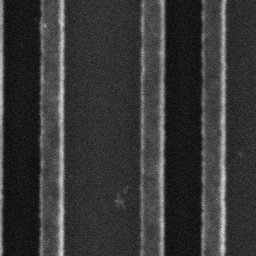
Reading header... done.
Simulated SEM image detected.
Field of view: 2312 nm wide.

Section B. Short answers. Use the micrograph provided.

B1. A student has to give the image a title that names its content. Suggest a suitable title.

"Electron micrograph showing lines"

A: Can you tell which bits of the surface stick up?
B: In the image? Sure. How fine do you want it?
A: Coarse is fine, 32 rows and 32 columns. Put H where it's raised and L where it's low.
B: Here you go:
LLLLLHHHLLLLLLLLLLHHHLLLLHHHLLLL
LLLLLHHHLLLLLLLLLLHHHLLLLHHHLLLL
LLLLLHHHLLLLLLLLLLHHHLLLLHHHLLLL
LLLLLHHHLLLLLLLLLLHHHLLLLHHHLLLL
LLLLLHHHLLLLLLLLLLHHHLLLLHHHLLLL
LLLLLHHHLLLLLLLLLLHHHLLLLHHHLLLL
LLLLLHHHLLLLLLLLLLHHHLLLLHHHLLLL
LLLLLHHHLLLLLLLLLLHHHLLLLHHHLLLL
LLLLLHHHLLLLLLLLLLHHHLLLLHHHLLLL
LLLLLHHHLLLLLLLLLLHHHLLLLHHHLLLL
LLLLLHHHLLLLLLLLLLHHHLLLLHHHLLLL
LLLLLHHHLLLLLLLLLLHHHLLLLHHHLLLL
LLLLLHHHLLLLLLLLLLHHHLLLLHHHLLLL
LLLLLHHHLLLLLLLLLLHHLLLLLHHHLLLL
LLLLLHHHLLLLLLLLLLHHHLLLLHHHLLLL
LLLLLHHHLLLLLLLLLLHHHLLLLHHHLLLL
LLLLLHHHLLLLLLLLLLHHLLLLLHHHLLLL
LLLLLHHHLLLLLLLLLLHHHLLLLHHHLLLL
LLLLLHHHLLLLLLLLLLHHLLLLLHHHLLLL
LLLLLHHHLLLLLLLLLLHHLLLLLHHHLLLL
LLLLLHHHLLLLLLLLLLHHLLLLLHHHLLLL
LLLLLHHHLLLLLLLLLLHHLLLLLHHHLLLL
LLLLLHHHLLLLLLLLLLHHLLLLLHHHLLLL
LLLLLHHHLLLLLLLLLLHHLLLLLHHHLLLL
LLLLLHHHLLLLLLLLLLHHLLLLLHHHLLLL
LLLLLHHHLLLLLLLLLLHHLLLLLHHHLLLL
LLLLLHHHLLLLLLLLLLHHLLLLLHHHLLLL
LLLLLHHHLLLLLLLLLLHHLLLLLHHHLLLL
LLLLLHHHLLLLLLLLLLHHLLLLLHHHLLLL
LLLLLHHHLLLLLLLLLLHHLLLLLHHHLLLL
LLLLLHHHLLLLLLLLLLHHLLLLLHHHLLLL
LLLLLHHHLLLLLLLLLLHHLLLLLHHHLLLL